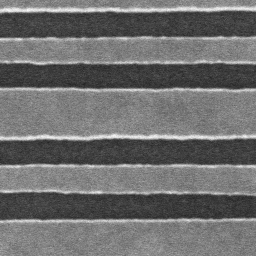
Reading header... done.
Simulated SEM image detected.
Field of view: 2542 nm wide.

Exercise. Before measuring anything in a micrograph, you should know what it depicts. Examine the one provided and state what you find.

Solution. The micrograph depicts lines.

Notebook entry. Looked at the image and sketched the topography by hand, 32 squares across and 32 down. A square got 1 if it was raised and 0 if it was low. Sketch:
11111111111111111111111111111111
00000000000000000000000000000000
00000000000000000000000000000000
00000000000000000000000000000000
00000000000000000000000000000000
11111111111111111111111111111111
11111111111111111111111111111111
11111111111111111111111111111111
00000000000000000000000000000000
00000000000000000000000000000000
00000000000000000000000000000000
11111111111111111111111111111111
11111111111111111111111111111111
11111111111111111111111111111111
11111111111111111111111111111111
11111111111111111111111111111111
11111111111111111111111111111111
00000000000000000000000000000000
00000000000000000000000000000000
00000000000000000000000000000000
00000000000000000000000000000000
11111111111111111111111111111111
11111111111111111111111111111111
11111111111111111111111111111111
00000000000000000000000000000000
00000000000000000000000000000000
00000000000000000000000000000000
00000000000000000000011110111111
11111111111111111111111111111111
11111111111111111111111111111111
11111111111111111111111111111111
11111111111111111111111111111111